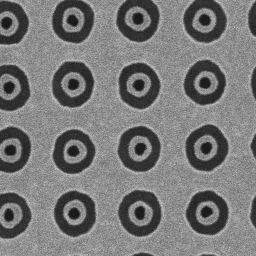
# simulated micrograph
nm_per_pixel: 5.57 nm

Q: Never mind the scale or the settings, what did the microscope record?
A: a regular array of ring-shaped grooves with a dot in the middle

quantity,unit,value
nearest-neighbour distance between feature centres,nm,356